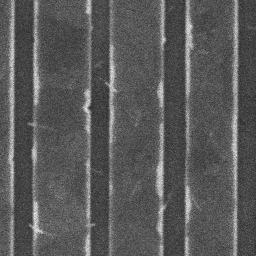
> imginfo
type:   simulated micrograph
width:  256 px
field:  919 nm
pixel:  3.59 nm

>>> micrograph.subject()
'one or a few lines or trenches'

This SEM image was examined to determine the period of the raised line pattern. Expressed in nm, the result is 269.